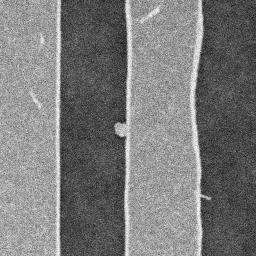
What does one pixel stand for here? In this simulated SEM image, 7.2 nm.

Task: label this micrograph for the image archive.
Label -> one or a few lines or trenches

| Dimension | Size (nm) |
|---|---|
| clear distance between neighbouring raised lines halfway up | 493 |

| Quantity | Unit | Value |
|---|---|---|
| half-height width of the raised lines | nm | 518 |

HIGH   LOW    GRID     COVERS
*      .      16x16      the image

****....*****...
****....*****...
****....****....
****....****....
****....****....
****....****....
****....****....
****....****....
****....****....
****....****....
****....****....
****....****....
****....****....
****....****....
****....*****...
****....****....